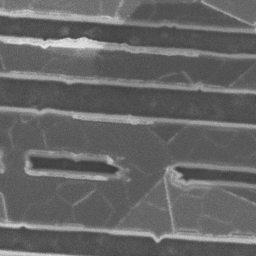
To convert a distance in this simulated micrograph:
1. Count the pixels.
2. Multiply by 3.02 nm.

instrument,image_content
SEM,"one or a few lines or trenches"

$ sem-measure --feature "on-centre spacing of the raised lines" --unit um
0.21